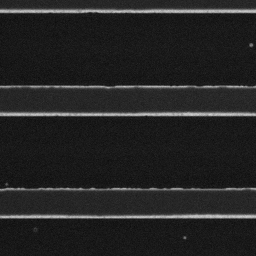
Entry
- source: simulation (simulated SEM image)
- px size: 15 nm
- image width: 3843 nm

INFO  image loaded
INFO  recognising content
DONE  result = lines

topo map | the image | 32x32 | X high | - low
XXXXXXXXXXXXXXXXXXXXXXXXXXXXXXXX
--------------------------------
--------------------------------
--------------------------------
--------------------------------
--------------------------------
--------------------------------
--------------------------------
--------------------------------
--------------------------------
--------------------------------
XXXXXXXXXXXXXXXXXXXXXXXXXXXXXXXX
XXXXXXXXXXXXXXXXXXXXXXXXXXXXXXXX
XXXXXXXXXXXXXXXXXXXXXXXXXXXXXXXX
--------------------------------
--------------------------------
--------------------------------
--------------------------------
--------------------------------
--------------------------------
--------------------------------
--------------------------------
--------------------------------
--------------------------------
XXXXXXXXXXXXXXXXXXXXXXXXXXXXXXXX
XXXXXXXXXXXXXXXXXXXXXXXXXXXXXXXX
XXXXXXXXXXXXXXXXXXXXXXXXXXXXXXXX
--------------------------------
--------------------------------
--------------------------------
--------------------------------
--------------------------------